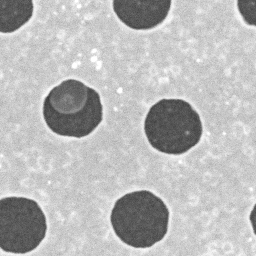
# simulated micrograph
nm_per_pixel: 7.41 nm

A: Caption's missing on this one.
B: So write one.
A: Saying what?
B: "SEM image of holes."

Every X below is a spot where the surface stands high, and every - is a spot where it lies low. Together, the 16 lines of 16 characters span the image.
--XXXXX----XXXX-
-XXXXXXX--XXXXXX
XXXXXXXXXXXXXXXX
XXXXXXXXXXXXXXXX
XXXXXXXXXXXXXXXX
XXX---XXXXXXXXXX
XXX---XXXX--XXXX
XXX---XXX----XXX
XXXX-XXXX----XXX
XXXXXXXXXX--XXXX
XXXXXXXXXXXXXXXX
XXXXXXXXXXXXXXXX
--XXXXX---XXXXXX
---XXXX----XXXXX
---XXXX---XXXXXX
--XXXXXXXXXXXXXX